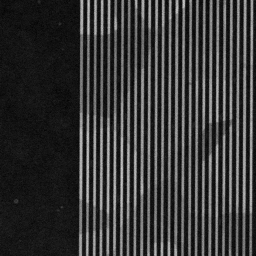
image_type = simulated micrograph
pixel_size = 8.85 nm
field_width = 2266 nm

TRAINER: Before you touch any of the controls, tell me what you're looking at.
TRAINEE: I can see parallel lines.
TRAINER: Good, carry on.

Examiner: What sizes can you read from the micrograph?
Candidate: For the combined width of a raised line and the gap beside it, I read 60.2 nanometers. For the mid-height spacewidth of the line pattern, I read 44.3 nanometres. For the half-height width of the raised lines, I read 17.7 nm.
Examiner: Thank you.